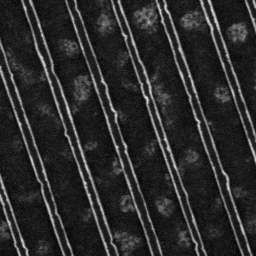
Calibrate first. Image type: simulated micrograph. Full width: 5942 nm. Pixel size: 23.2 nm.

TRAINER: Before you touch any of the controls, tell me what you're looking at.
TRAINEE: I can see parallel lines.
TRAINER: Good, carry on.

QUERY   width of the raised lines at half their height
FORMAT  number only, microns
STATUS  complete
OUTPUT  0.192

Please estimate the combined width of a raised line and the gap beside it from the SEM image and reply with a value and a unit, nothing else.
0.983 micrometres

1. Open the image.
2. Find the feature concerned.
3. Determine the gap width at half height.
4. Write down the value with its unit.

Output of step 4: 783 nm